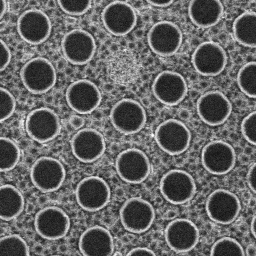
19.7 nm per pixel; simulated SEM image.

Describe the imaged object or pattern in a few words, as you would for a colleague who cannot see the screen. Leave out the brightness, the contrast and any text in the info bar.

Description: a regular array of raised bodies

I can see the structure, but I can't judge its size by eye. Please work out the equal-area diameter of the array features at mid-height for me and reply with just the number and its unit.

648 nanometres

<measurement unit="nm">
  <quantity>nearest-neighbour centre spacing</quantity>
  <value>966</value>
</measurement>